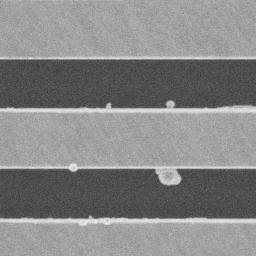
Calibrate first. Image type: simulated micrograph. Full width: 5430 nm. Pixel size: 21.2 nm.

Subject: lines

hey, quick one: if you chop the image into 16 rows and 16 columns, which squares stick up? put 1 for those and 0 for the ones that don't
1111111111111111
1111111111111111
1111111111111111
1111111111111111
0000000000000000
0000000000000000
0000000000000000
1111111111111111
1111111111111111
1111111111111111
0000100000000000
0000000000000000
0000000000000000
0000000000000000
1111111111111111
1111111111111111